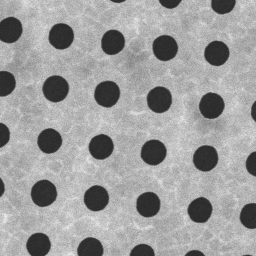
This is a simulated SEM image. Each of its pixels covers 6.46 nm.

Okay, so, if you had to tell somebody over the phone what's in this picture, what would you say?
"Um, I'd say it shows a regular array of holes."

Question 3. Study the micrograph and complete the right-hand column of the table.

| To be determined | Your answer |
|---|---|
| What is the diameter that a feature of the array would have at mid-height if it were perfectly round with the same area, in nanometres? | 165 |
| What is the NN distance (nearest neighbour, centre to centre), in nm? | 336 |